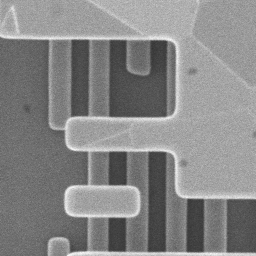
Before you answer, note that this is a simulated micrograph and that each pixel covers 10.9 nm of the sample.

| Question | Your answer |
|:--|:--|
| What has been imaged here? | wiring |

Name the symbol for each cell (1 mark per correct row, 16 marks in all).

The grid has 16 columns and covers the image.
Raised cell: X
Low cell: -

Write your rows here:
XXXXXXXXXXXXXXXX
XXXXXXXXXXXXXXXX
----------XXXXXX
-----------XXXXX
-----------XXXXX
-----------XXXXX
-----------XXXXX
----XXXXXXXXXXXX
----XXXXXXXXXXXX
----------XXXXXX
-----------XXXXX
-----------XXXXX
----XXXXX-------
-----XXX--------
----------------
----------------